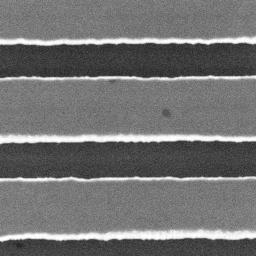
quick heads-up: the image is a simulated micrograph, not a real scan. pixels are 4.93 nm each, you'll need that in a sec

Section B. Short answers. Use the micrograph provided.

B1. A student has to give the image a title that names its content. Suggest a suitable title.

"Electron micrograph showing lines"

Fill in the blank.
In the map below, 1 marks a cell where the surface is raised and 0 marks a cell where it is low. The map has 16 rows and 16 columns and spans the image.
1111111111111111
1111111111111111
1111111111111111
0000000000000000
0000000000000000
1111111111111111
1111111111111111
1111111111111111
1111111111111111
0000000000000000
0000000000000000
1111111111111111
1111111111111111
1111111111111111
1111111111111111
0000000000000000